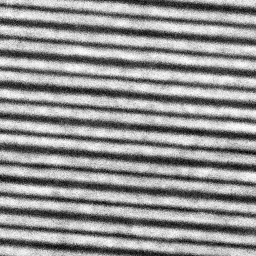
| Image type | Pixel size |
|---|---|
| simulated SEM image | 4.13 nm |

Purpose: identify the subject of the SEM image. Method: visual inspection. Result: parallel lines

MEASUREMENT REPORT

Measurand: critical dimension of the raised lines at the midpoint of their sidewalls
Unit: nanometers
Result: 31.9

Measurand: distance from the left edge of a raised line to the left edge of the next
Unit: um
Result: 0.0646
